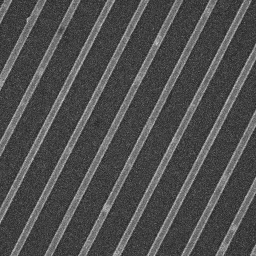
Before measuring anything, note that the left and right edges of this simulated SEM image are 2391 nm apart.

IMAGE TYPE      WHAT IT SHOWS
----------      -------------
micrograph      parallel lines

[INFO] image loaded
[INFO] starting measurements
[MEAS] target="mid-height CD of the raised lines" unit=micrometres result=0.0592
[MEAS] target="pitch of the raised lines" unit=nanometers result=284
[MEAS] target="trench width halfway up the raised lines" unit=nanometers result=226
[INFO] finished